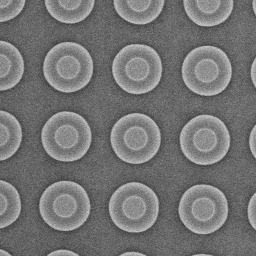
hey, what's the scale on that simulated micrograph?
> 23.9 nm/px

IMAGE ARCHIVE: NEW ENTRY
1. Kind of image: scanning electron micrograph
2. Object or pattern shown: an array of small figures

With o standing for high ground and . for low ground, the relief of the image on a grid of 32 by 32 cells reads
ooo...oooooo..oooooo...oooooo...
ooo...ooooo....ooooo...oooooo...
o......ooo......ooo.....oooo....
................................
................................
o......ooo......................
oo....ooooo....oooo.....oooo....
ooo...ooooo...oooooo...oooooo...
ooo..ooooooo..oooooo...oooooo..o
ooo...ooooo...oooooo...oooooo..o
oo....ooooo....ooooo...ooooo....
........o.......oo......oooo....
................................
................................
oo.....ooo......oo.......oo.....
oo....ooooo...ooooo....ooooo....
ooo..oooooo...oooooo...oooooo..o
ooo..oooooo...oooooo...oooooo..o
oo....ooooo...oooooo...oooooo..o
o.....oooo.....oooo....ooooo....
.........................o......
................................
................................
oo....oooo.....oooo.....ooo.....
oo...oooooo...oooooo...ooooo....
ooo..oooooo...oooooo..oooooo...o
oo...oooooo...oooooo..oooooo...o
oo....ooooo...ooooo....ooooo...o
.......ooo.....oooo....oooo.....
................................
................................
o......oo.......................